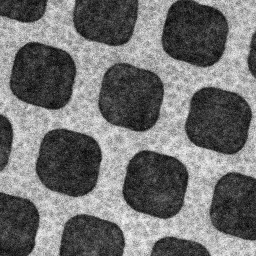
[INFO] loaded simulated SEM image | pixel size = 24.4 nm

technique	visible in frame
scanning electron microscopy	holes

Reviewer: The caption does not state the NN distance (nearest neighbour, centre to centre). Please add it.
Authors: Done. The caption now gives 2190 nanometers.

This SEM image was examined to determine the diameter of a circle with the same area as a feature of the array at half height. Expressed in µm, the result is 1.64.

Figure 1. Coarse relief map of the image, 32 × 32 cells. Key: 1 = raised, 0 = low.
00000011100000000111110001111111
00000011100000000111100000001111
11000111100000000111100000001111
11111111100000000111000000000111
11111111110000000111000000001111
11100011111110001111000000001110
11000000111111111111100000001110
11000000011111111111110000011110
10000000001111000111111111111110
10000000011110000000111111111111
10000000011110000000111111111111
10000000011100000000011100000111
11000000011100000000111100000001
11111000111100000000111100000001
01111111111110000000111000000001
01111111111111000001111000000001
00111100001111111111111000000001
00111000000011111111111100000001
01111000000001111111111110000011
01111000000001111000011111111111
01111000000001110000000111111111
11111000000011110000000111111111
11111000000011110000000011100000
11111100000011100000000111100000
00111111101111100000000111100000
00001111111111110000000111000000
00000111111111111000001111000000
00000111100001111111111111000000
00000111000000011111111111100000
00001111000000001111111111111000
00001111000000001110000001111111
00001110000000011110000000111111